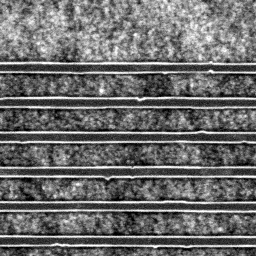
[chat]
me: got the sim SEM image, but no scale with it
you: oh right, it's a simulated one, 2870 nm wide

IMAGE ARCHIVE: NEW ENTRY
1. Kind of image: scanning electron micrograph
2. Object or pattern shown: parallel lines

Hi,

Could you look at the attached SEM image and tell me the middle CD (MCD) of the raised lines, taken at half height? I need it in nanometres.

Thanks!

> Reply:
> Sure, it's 109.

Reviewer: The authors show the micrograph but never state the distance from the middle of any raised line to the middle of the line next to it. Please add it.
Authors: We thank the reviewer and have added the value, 0.389 µm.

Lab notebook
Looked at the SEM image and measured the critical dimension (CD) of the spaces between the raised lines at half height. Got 275 nanometres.